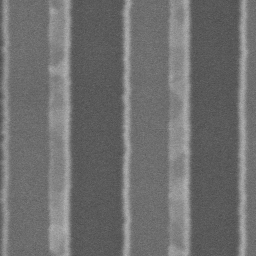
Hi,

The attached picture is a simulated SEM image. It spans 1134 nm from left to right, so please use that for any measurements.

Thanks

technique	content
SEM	lines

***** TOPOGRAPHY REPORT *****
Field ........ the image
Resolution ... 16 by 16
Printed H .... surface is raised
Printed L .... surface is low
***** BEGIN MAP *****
HHHHLLLLHHHHLLLH
HHHHLLLLHHHHLLLH
HHHHLLLLHHHHLLLH
HHHHLLLLHHHHLLLH
HHHHLLLLHHHHLLLH
HHHHLLLLHHHHLLLH
HHHHLLLLHHHHLLLH
HHHHLLLLHHHHLLLH
HHHHLLLLHHHHLLLH
HHHHLLLLHHHHLLLH
HHHHLLLLHHHHLLLH
HHHHLLLLHHHHLLLH
HHHHLLLLHHHHLLLH
HHHHLLLLHHHHLLLH
HHHHLLLLHHHHLLLH
HHHHLLLLHHHHLLLH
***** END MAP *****